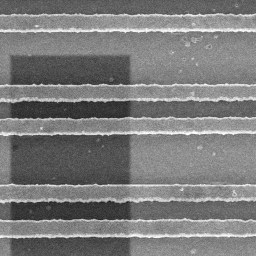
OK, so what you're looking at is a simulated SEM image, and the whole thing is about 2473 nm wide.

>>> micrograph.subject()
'lines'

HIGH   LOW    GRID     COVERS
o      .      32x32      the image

................................
................................
oooooooooooooooooooooooooooooooo
oooooooooooooooooooooooooooooooo
................................
................................
................................
................................
................................
................................
................................
oooooooooooooooooooooooooooooooo
oooooooooooooooo.oooooo.ooo.oo..
................................
................................
oooooooooooooooooooooooooooooooo
oooooooooooooooooooooooooooooooo
................................
................................
................................
................................
................................
................................
oooooooooooooooooooooooooooooooo
oooooooooooooooooooooooooooooooo
................................
................................
o....ooo.ooooooo.ooooooooooooo.o
oooooooooooooooooooooooooooooooo
ooooooooooo.oooooooooooo......o.
................................
................................